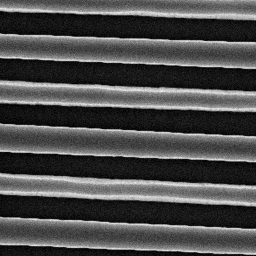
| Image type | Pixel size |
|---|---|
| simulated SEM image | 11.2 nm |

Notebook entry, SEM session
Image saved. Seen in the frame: lines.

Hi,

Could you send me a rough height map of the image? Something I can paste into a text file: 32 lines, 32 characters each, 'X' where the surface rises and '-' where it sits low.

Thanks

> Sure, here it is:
XXXXXXXXXXXXXXXXXXXXXXXXXXXXXXXX
------XXXXXXXXXXXXXXXXXXXXXXXXXX
--------------------------------
--------------------------------
XXXXXXX-------------------------
XXXXXXXXXXXXXXXXXXXXXXXXXXXXXXXX
XXXXXXXXXXXXXXXXXXXXXXXXXXXXXXXX
-------XXXXXXXXXXXXXXXXXXXXXXXXX
------------------------------XX
--------------------------------
XXX-----------------------------
XXXXXXXXXXXXXXXXXXXXXXXXXXXX----
XXXXXXXXXXXXXXXXXXXXXXXXXXXXXXXX
--------------------XXXXXXXXXXXX
--------------------------------
X-------------------------------
XXXXXXXXXXXXXXXXXXXX------------
XXXXXXXXXXXXXXXXXXXXXXXXXXXXXXXX
XXXXXXXXXXXXXXXXXXXXXXXXXXXXXXXX
---------------XXXXXXXXXXXXXXXXX
--------------------------------
--------------------------------
XXXXXXXXXX----------------------
XXXXXXXXXXXXXXXXXXXXXXXXXXXXXXXX
---------XXXXXXXXXXXXXXXXXXXXXXX
-----------------------------XXX
--------------------------------
XXXXXXXX------------------------
XXXXXXXXXXXXXXXXXXXXXXXXXXXX----
XXXXXXXXXXXXXXXXXXXXXXXXXXXXXXXX
XXXXXXXXXXXXXXXXXXXXXXXXXXXXXXXX
------------------------XXXXXXXX